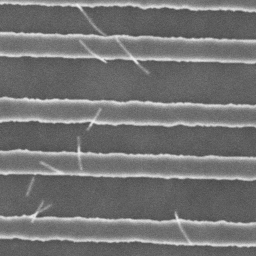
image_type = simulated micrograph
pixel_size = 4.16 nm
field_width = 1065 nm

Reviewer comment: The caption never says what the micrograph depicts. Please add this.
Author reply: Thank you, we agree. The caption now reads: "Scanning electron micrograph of lines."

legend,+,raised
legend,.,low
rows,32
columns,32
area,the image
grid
++++++++++++++++++++++++++++++++
................................
................................
................................
+++++++++++++.++................
++++++++++++++++++++++++++++++++
++++++++++++++++++++++++++++++++
................++++++++++++++++
................................
................................
................................
................................
+++++.+++.......................
++++++++++++++++++++++++++++++++
++++++++++++++++++++++++++++++++
..............+.++++++++++++++++
................................
................................
................................
++++++++++++++++++++++++..+.....
++++++++++++++++++++++++++++++++
++++++++++++++++++++++++++++++++
..............................++
................................
................................
................................
................................
+++++++++++++++++.....+.........
++++++++++++++++++++++++++++++++
++++++++++++++++++++++++++++++++
......................++++++++++
................................